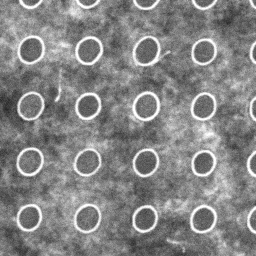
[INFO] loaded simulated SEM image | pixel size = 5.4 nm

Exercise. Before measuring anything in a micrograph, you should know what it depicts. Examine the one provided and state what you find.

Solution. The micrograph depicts a regular array of raised bodies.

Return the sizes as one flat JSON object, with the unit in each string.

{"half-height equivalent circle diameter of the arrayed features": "25.5 px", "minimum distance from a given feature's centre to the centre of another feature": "301 nanometers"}